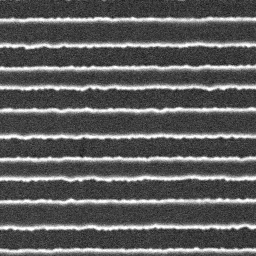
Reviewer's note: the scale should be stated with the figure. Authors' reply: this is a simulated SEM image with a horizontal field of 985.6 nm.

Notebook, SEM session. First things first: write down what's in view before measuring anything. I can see lines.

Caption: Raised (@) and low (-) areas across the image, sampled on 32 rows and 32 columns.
--------------------------------
--------------------------------
@@@@@@@@@@@@@@@@@@@@@@@@@@@@@@@@
@@@@@@@@@@@@@@@@@@@@@@@@@@@@@@@@
@@@@@@@@@@@@@@@@@@@@@@@@@@@@@@@@
@@@@@@@@@@@@@@@@@@@@@@@@@@@@@@@@
--------------------------------
--------------------------------
@@-@@@@@@@@@@@@@@@@@@@@@@@@@@@@@
@@@@@@@@@@@@@@@@@@@@@@@@@@@@@@@@
@@@@@@@@@@@@@@@@@@@@@@@@@@@@@@@@
--------------------------------
--------------------------------
--------------------------------
@@@@@@@@@@@@@@@@@@@@@@@@@@@@@@@@
@@@@@@@@@@@@@@@@@@@@@@@@@@@@@@@@
@@@@@@@@@@@@@@@@@@@@@@@@@@@@@@@@
--------------------------------
--------------------------------
--------------------------------
@@@@@@@@@@@@@@@@@@@@@@@@@@@@@@@@
@@@@@@@@@@@@@@@@@@@@@@@@@@@@@@@@
--@@@---@@@--@--@---------------
--------------------------------
--------------------------------
@@@@@@@@@@@@@@@@@@@@@@@@@@@@@@@@
@@@@@@@@@@@@@@@@@@@@@@@@@@@@@@@@
@@@@@@@@@@@@@@@@@@@@@@@@@@@@@@@@
@@@@@@@@@@@-@@@@-@@---@@-@-@----
--------------------------------
--------------------------------
@@@@@@@@@@@@@@@@@@@@@@@@@@@@@@@@